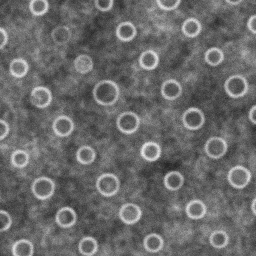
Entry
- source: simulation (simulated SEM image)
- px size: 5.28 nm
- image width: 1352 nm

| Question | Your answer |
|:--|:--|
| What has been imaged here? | a regular array of raised bodies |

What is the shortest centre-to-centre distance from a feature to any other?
36.7 pixels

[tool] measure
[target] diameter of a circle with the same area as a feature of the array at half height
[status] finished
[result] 90.7 nm